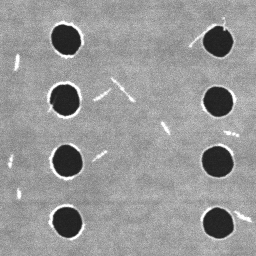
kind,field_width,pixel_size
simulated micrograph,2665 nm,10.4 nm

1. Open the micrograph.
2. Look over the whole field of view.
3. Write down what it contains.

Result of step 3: a regular array of holes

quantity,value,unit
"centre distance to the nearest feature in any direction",0.629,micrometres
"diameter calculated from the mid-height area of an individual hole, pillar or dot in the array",0.321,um